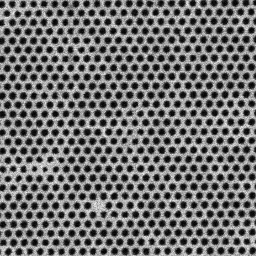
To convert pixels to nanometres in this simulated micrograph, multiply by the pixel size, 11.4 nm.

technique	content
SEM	a regular array of holes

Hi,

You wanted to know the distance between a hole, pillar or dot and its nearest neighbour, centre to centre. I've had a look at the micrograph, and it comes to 117 nm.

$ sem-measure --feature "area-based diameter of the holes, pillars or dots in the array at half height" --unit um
0.0847